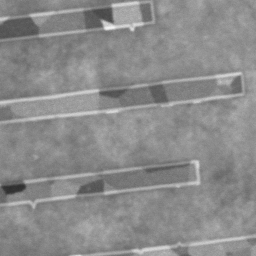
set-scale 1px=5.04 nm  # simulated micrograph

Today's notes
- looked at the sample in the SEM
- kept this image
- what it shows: one or a few lines or trenches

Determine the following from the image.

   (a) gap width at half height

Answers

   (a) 61.1 px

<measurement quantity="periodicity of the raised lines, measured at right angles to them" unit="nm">413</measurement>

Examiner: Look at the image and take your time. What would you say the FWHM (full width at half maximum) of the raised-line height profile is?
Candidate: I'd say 104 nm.